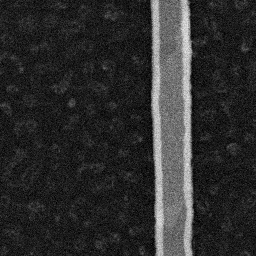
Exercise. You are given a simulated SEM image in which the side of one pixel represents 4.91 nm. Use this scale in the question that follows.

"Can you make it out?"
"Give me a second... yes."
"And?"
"one or a few lines or trenches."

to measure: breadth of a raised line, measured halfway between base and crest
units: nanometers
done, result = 145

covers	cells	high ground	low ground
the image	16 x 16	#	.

..........##....
..........##....
..........##....
..........##....
..........##....
..........##....
..........##....
..........##....
..........##....
..........##....
..........##....
..........##....
..........##....
..........##....
..........##....
..........##....